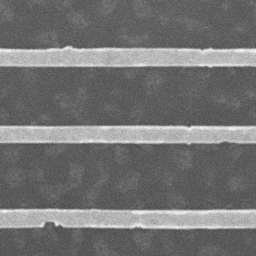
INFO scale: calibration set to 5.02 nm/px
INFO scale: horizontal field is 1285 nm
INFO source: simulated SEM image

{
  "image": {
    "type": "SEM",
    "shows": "one or a few lines or trenches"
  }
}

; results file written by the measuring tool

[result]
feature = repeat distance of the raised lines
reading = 405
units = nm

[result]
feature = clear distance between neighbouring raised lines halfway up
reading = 0.306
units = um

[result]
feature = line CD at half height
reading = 83.4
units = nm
